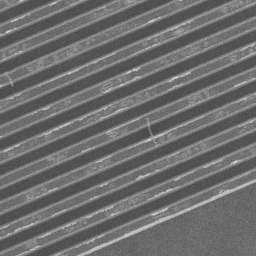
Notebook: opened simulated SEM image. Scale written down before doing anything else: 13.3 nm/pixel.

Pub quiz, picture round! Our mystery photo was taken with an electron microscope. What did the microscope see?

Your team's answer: parallel lines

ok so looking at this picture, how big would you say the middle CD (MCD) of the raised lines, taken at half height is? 149 nanometres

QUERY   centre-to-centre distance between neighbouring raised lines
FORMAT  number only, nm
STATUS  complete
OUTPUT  309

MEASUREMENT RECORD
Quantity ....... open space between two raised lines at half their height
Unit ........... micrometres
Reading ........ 0.162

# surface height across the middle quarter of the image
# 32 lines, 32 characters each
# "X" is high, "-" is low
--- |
-----XXXXXXX-------XXXXXXX------
--XXXXXXX--------XXXXXXX--------
XXXXXXX--------XXXXXX---------XX
XXXX--------XXXXXXX--------XXXXX
XX--------XXXXXXX--------XXXXXX-
--------XXXXXXX-------XXXXXXX---
-----XXXXXXX--------XXXXXXX-----
---XXXXXXX--------XXXXXX--------
-XXXXXXX-------XXXXXXX--------XX
XXXXX--------XXXXXXX--------XXXX
XXX-------XXXXXXX--------XXXXXXX
---------XXXXXX--------XXXXXXX--
------XXXXXXX--------XXXXXXX----
----XXXXXX--------XXXXXXX-------
-XXXXXXX--------XXXXXXX--------X
XXXXXX--------XXXXXXX--------XXX
XXX--------XXXXXXX--------XXXXXX
X--------XXXXXXX--------XXXXXXX-
-------XXXXXXX-------XXXXXXXX---
----XXXXXXX--------XXXXXXX------
--XXXXXXX--------XXXXXXX--------
XXXXXXX--------XXXXXXX-------XXX
XXXX--------XXXXXXX--------XXXXX
XX--------XXXXXXX--------XXXXXXX
--------XXXXXXX-------XXXXXXX---
-----XXXXXXX--------XXXXXXX-----
---XXXXXXX--------XXXXXXX-------
-XXXXXXX-------XXXXXXX--------XX
XXXXX--------XXXXXXX--------XXXX
XXX--------XXXXXX---------XXXXXX
X-------XXXXXXX--------XXXXXXX--
------XXXXXXX--------XXXXXX-----